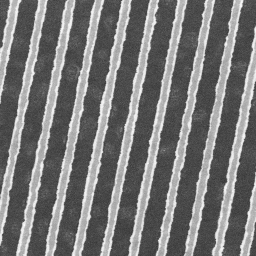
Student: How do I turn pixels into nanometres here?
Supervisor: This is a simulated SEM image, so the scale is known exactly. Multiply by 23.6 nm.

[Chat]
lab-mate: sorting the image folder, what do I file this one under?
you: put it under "parallel lines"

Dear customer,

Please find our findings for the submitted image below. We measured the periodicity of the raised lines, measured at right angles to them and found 646 nm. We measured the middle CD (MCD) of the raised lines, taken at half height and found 185 nanometers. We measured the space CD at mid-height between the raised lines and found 0.472 um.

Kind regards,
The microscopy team